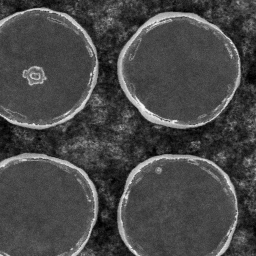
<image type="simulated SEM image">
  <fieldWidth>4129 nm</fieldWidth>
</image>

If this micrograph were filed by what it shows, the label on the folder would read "raised bodies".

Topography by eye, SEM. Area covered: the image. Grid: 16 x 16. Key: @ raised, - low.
----------------
@@@@@----@@@@---
@@@@@@--@@@@@@--
@@@@@@--@@@@@@@-
@@@@@@-@@@@@@@@-
@@@@@@--@@@@@@@-
@@@@@---@@@@@@--
@@@@------@@@---
----------------
----------------
@@@@@----@@@@@--
@@@@@@--@@@@@@--
@@@@@@--@@@@@@@-
@@@@@@-@@@@@@@@-
@@@@@@--@@@@@@@-
@@@@@---@@@@@@--